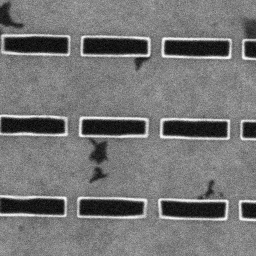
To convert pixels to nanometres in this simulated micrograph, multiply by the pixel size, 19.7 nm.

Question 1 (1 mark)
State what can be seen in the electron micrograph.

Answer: an array of small figures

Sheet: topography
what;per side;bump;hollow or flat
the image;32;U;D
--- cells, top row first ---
DDDDDDDDDDDDDDDDDDDDDDDDDDDDDDDD
DDDDDDDDDDDDDDDDDDDDDDDDDDDDDDDD
DDDDDDDDDDDDDDDDDDDDDDDDDDDDDDDD
DDDDDDDDDDDDDDDDDDDDDDDDDDDDDDDD
DUUUUUUUDDDDDDDDDDDDDDDDDDDDDDDD
UUUUUUUUUDUUUUUUUUUDUUUUUUUUUDUU
DUUUUUUUUDUUUUUUUUUDUUUUUUUUUDUU
DDDDDDDDDDDDDDDDDDDDDDDDDDDDDDDD
DDDDDDDDDDDDDDDDDDDDDDDDDDDDDDDD
DDDDDDDDDDDDDDDDDDDDDDDDDDDDDDDD
DDDDDDDDDDDDDDDDDDDDDDDDDDDDDDDD
DDDDDDDDDDDDDDDDDDDDDDDDDDDDDDDD
DDDDDDDDDDDDDDDDDDDDDDDDDDDDDDDD
DDDDDDDDDDDDDDDDDDDDDDDDDDDDDDDD
UUDDDDDDDDDDDDDDDDDDDDDDDDDDDDDD
UUUUUUUUDDUUUUUUUUDDUUUUUUUUUDUU
UUUUUUUUDDUUUUUUUUDDUUUUUUUUUDUU
DDDDDDDDDDDDDDDDDDDDDDDDDDDDDDDD
DDDDDDDDDDDDDDDDDDDDDDDDDDDDDDDD
DDDDDDDDDDDDDDDDDDDDDDDDDDDDDDDD
DDDDDDDDDDDDDDDDDDDDDDDDDDDDDDDD
DDDDDDDDDDDDDDDDDDDDDDDDDDDDDDDD
DDDDDDDDDDDDDDDDDDDDDDDDDDDDDDDD
DDDDDDDDDDDDDDDDDDDDDDDDDDDDDDDD
UDDDDDDDDDDDDDDDDDDDDDDDDDDDDDDD
UUUUUUUUDDUUUUUUUUDDUUUUUUUUDDUU
UUUUUUUUDDUUUUUUUUDDUUUUUUUUDDUU
DDDDDDDDDDDDDDDDDDDDDDDDDDDDDDDD
DDDDDDDDDDDDDDDDDDDDDDDDDDDDDDDD
DDDDDDDDDDDDDDDDDDDDDDDDDDDDDDDD
DDDDDDDDDDDDDDDDDDDDDDDDDDDDDDDD
DDDDDDDDDDDDDDDDDDDDDDDDDDDDDDDD